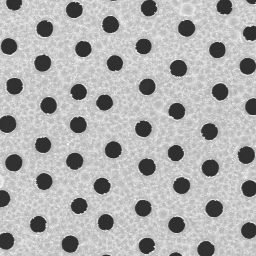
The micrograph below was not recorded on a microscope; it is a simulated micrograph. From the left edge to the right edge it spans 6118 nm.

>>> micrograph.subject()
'a regular array of holes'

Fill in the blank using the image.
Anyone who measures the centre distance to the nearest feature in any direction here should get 851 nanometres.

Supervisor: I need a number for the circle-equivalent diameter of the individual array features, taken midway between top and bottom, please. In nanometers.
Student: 400